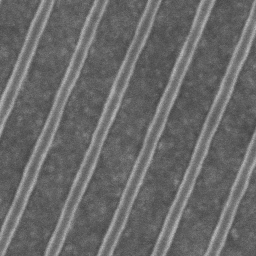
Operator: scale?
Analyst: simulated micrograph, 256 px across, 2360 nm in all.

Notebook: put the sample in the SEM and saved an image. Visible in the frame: parallel lines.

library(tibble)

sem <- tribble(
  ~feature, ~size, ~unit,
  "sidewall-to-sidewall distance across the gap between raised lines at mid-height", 352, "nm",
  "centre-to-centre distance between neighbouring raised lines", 49.5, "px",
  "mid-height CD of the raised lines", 107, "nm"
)